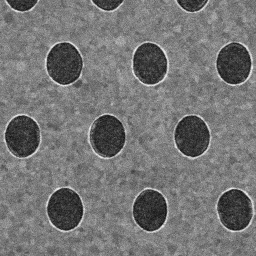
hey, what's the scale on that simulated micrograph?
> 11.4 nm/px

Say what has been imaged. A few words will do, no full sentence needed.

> a regular array of holes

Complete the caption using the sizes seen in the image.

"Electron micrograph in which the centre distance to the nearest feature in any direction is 957 nm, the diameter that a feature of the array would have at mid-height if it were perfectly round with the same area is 441 nanometers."